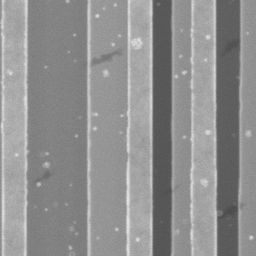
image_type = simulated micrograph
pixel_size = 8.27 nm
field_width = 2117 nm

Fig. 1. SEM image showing lines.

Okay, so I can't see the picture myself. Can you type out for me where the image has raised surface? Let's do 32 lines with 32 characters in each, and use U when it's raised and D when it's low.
UUUDDDDDDDDUUUUUUUUDDDUUUUUDDDUU
UUUDDDDDDDDUUUUUUUUDDDUUUUUDDDUU
UUUDDDDDDDDUUUUUUUUDDDUUUUUDDDUU
UUUDDDDDDDDUUUUUUUUDDDUUUUUDDDUU
UUUDDDDDDDDUUUUUUUUDDDUUUUUDDDUU
UUUDDDDDDDDUUUUUUUUDDDUUUUUDDDUU
UUUDDDDDDDDUUUUUUUUDDDUUUUUDDDUU
UUUDDDDDDDDUUUUUUUUDDDUUUUUDDDUU
UUUDDDDDDDDUUUUUUUUDDDUUUUUDDDUU
UUUDDDDDDDDUUUUUUUUDDDUUUUUDDDUU
UUUDDDDDDDDUUUUUUUUDDDUUUUUDDDUU
UUUDDDDDDDDUUUUUUUUDDDUUUUUDDDUU
UUUDDDDDDDDUUUUUUUUDDDUUUUUDDDUU
UUUDDDDDDDDUUUUUUUUDDDUUUUUDDDUU
UUUDDDDDDDDUUUUUUUUDDDUUUUUDDDUU
UUUDDDDDDDDUUUUUUUUDDUUUUUUDDDUU
UUUDDDDDDDDUUUUUUUUDDDUUUUUDDDUU
UUUDDDDDDDDUUUUUUUUDDDUUUUUDDDUU
UUUDDDDDDDDUUUUUUUUDDDUUUUUDDDUU
UUUDDDDDDDDUUUUUUUUDDDUUUUUDDDUU
UUUDDDDDDDDUUUUUUUUDDDUUUUUDDDUU
UUUDDDDDDDDUUUUUUUUDDDUUUUUDDDUU
UUUDDDDDDDDUUUUUUUUDDDUUUUUDDDUU
UUUDDDDDDDDUUUUUUUUDDDUUUUUDDDUU
UUUDDDDDDDDUUUUUUUUDDDUUUUUDDDUU
UUUDDDDDDDDUUUUUUUUDDDUUUUUDDDUU
UUUDDDDDDDDUUUUUUUUDDDUUUUUDDDUU
UUUDDDDDDDDUUUUUUUUDDDUUUUUDDDUU
UUUDDDDDDDDUUUUUUUUDDDUUUUUDDDUU
UUUDDDDDDDDUUUUUUUUDDDUUUUUDDDUU
UUUDDDDDDDDUUUUUUUUDDDUUUUUDDDUU
UUUDDDDDDDDUUUUUUUUDDUUUUUUDDDUU